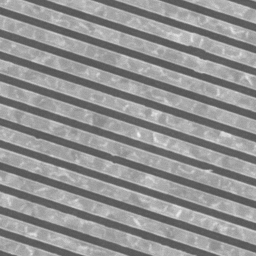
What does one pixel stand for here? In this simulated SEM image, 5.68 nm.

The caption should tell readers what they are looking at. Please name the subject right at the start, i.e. parallel lines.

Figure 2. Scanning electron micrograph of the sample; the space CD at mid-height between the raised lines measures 45.9 nm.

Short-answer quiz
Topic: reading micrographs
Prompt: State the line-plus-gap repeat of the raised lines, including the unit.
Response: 120 nm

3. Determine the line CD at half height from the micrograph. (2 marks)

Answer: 71.6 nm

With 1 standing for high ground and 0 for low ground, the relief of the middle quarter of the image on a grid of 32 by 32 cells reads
11111100000001111111111000000111
11111111100000001111111111000000
00111111111100000001111111111000
00000111111111110000001111111111
10000000111111111110000001111111
11110000000111111111110000001111
11111110000000111111111110000001
11111111110000000011111111110000
00011111111111000000111111111110
00000011111111111000000111111111
11000000001111111111000000111111
11111000000001111111111000000011
11111111000000001111111111000000
01111111111100000001111111111000
00001111111111100000001111111111
10000000111111111100000001111111
11110000000111111111100000001111
11111110000000111111111100000001
11111111110000000111111111100000
00011111111110000000111111111100
00000011111111110000000111111111
11000000011111111110000000111111
11111000000011111111111000000111
11111111000000001111111111000000
01111111111000000001111111111000
00001111111111000000001111111111
10000001111111111000000001111111
11110000001111111111100000001111
11111110000000111111111100000001
11111111110000000111111111100000
00011111111110000000111111111100
00000011111111110000000111111111